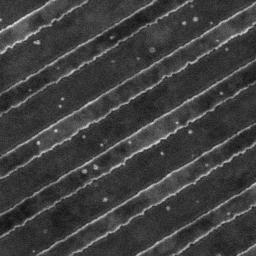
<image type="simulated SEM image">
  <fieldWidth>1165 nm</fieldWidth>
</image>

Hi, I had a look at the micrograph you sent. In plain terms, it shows lines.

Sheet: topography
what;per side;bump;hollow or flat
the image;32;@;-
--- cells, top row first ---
------@@@@---------@@@@---------
----@@@@@--------@@@@---------@@
--@@@@@--------@@@@@--------@@@@
-@@@@---------@@@@---------@@@@-
@@@@--------@@@@---------@@@@---
@@--------@@@@@--------@@@@@----
---------@@@@---------@@@@------
-------@@@@@--------@@@@@-------
-----@@@@@--------@@@@@-------@@
----@@@@---------@@@@--------@@@
--@@@@---------@@@@@-------@@@@@
@@@@@--------@@@@@-------@@@@@--
@@@---------@@@@--------@@@@----
@@--------@@@@@-------@@@@@-----
--------@@@@@-------@@@@@-------
-------@@@@--------@@@@@--------
-----@@@@@-------@@@@@--------@@
----@@@@-------@@@@@--------@@@@
--@@@@@-------@@@@---------@@@@-
@@@@@-------@@@@@--------@@@@---
@@@--------@@@@---------@@@@----
@--------@@@@@-------@@@@@------
-------@@@@@--------@@@@@-------
-----@@@@@--------@@@@@--------@
----@@@@@--------@@@@--------@@@
--@@@@@--------@@@@@--------@@@@
-@@@@---------@@@@--------@@@@@-
@@@@--------@@@@--------@@@@@---
@@--------@@@@@--------@@@@-----
---------@@@@--------@@@@@------
-------@@@@--------@@@@@--------
-----@@@@@--------@@@@@--------@